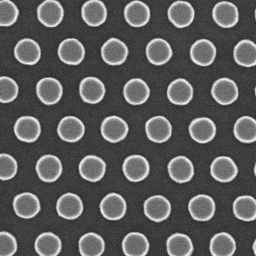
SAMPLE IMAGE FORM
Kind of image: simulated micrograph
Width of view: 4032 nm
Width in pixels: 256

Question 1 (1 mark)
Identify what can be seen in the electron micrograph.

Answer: a regular array of raised bodies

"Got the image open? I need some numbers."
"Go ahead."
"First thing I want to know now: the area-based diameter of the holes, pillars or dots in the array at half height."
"406 nm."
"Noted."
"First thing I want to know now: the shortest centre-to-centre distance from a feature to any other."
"684 nm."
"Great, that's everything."